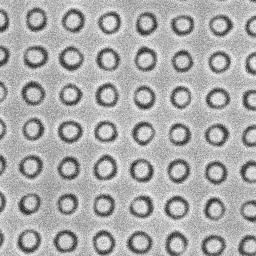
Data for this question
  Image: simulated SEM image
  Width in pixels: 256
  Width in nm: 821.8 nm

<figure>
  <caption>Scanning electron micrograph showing a regular array of ring-shaped grooves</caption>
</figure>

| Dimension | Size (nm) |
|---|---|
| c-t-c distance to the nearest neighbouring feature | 115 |